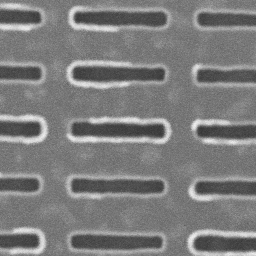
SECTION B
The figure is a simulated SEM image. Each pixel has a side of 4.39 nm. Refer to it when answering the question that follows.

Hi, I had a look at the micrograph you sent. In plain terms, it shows holes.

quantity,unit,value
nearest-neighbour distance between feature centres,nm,245